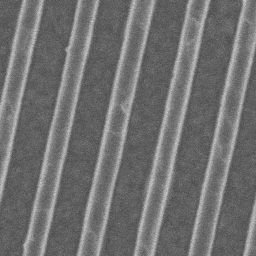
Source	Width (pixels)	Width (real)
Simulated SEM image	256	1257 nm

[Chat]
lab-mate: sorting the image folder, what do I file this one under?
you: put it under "parallel lines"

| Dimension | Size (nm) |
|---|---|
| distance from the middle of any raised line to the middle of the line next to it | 265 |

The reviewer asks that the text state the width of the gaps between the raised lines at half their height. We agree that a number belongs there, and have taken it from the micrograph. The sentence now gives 35.3 pixels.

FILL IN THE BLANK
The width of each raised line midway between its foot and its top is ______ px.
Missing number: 18.7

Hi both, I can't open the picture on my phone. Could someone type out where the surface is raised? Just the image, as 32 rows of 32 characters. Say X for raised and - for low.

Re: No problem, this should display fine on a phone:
---XX-----XX-----XX-----XX----XX
---XX-----XX----XXX----XXX----XX
--XXX----XXX----XXX----XXX----XX
--XXX----XX-----XXX----XX-----XX
--XX-----XX-----XX-----XX-----XX
--XX-----XX-----XX-----XX----XXX
--XX----XXX----XXX----XXX----XXX
-XXX----XXX----XXX----XX-----XX-
-XX-----XX-----XX-----XX-----XX-
-XX-----XX-----XX-----XX-----XX-
-XX-----XX----XXX-----XX----XXX-
-XX----XXX----XXX----XXX----XXX-
XXX----XXX----XX-----XX-----XX--
XX-----XX-----XX-----XX-----XX--
XX-----XX-----XX-----XX----XXX--
XX-----XX----XXX----XXX----XXX--
XX----XXX----XXX----XX-----XX---
XX----XX-----XX-----XX-----XX---
X-----XX-----XX-----XX-----XX---
X-----XX-----XX-----XX----XXX---
X-----XX----XXX----XXX----XXX---
X----XXX----XXX----XX-----XX----
-----XX-----XX-----XX-----XX----
-----XX-----XX-----XX----XXX----
-----XX----XXX----XXX----XXX----
----XXX----XXX----XXX----XXX----
----XX-----XX-----XX-----XX-----
----XX-----XX-----XX-----XX----X
----XX-----XX-----XX----XXX----X
----XX----XXX----XXX----XXX----X
---XXX----XXX----XX-----XX-----X
---XX-----XX-----XX-----XX-----X